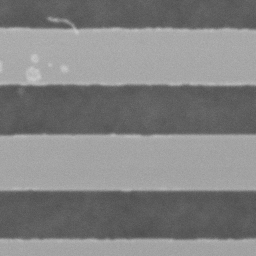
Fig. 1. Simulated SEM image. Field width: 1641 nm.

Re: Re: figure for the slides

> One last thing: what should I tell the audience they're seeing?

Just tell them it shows lines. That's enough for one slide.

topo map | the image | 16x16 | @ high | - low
----------------
----------------
@@@@@@@@@@@@@@@@
@@@@@@@@@@@@@@@@
@@@@@@@@@@@@@@@@
----------------
----------------
----------------
@@@@@@@@@@@@@@@@
@@@@@@@@@@@@@@@@
@@@@@@@@@@@@@@@@
@@@@@@@@@@@@@@@@
----------------
----------------
----------------
@@@@@@@@@@@@@@@@